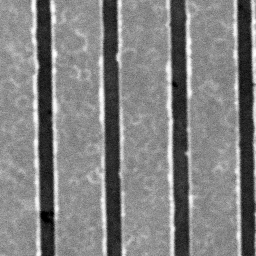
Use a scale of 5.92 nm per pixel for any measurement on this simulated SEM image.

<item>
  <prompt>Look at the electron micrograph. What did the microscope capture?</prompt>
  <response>one or a few lines or trenches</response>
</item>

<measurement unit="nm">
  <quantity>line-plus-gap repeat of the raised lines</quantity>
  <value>399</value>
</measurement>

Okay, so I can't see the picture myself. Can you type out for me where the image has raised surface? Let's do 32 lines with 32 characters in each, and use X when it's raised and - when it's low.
XXXX--XXXXXXX--XXXXXX--XXXXXXX-X
XXXX--XXXXXXX--XXXXXX--XXXXXXX--
XXXX--XXXXXXX--XXXXXX--XXXXXXX--
XXXX--XXXXXXX--XXXXXX--XXXXXXX--
XXXX---XXXXXX--XXXXXX--XXXXXXX--
XXXX---XXXXXX--XXXXXX--XXXXXXX--
XXXX---XXXXXX--XXXXXX--XXXXXXX--
XXXXX--XXXXXX--XXXXXX--XXXXXXX--
XXXXX--XXXXXX--XXXXXX---XXXXXX--
XXXXX--XXXXXX--XXXXXX---XXXXXX--
XXXXX--XXXXXX--XXXXXX--XXXXXXX--
XXXXX--XXXXXX--XXXXXX---XXXXXX--
XXXXX--XXXXXX--XXXXXX---XXXXXX--
XXXXX--XXXXXX--XXXXXX--XXXXXXX--
XXXXX--XXXXXX--XXXXXX--XXXXXXX--
XXXXX--XXXXXX--XXXXXXX--XXXXXX--
XXXXX--XXXXXX--XXXXXX---XXXXXX--
XXXXX--XXXXXX--XXXXXX---XXXXXX--
XXXXX--XXXXXX--XXXXXX---XXXXXX--
XXXXX--XXXXXX--XXXXXX---XXXXXX--
XXXXX--XXXXXX--XXXXXXX--XXXXXX--
XXXXX--XXXXXX--XXXXXXX--XXXXXX--
XXXXX--XXXXXX--XXXXXXX--XXXXXX--
XXXXX--XXXXXX--XXXXXXX--XXXXXX--
XXXXX--XXXXXX--XXXXXXX--XXXXXX--
XXXXX--XXXXXX--XXXXXXX--XXXXXX--
XXXXX--XXXXXX--XXXXXXX--XXXXXX--
XXXXX--XXXXXX--XXXXXXX--XXXXXX--
XXXXX--XXXXXX--XXXXXXX--XXXXXX--
XXXXX--XXXXXX--XXXXXXX--XXXXXX--
XXXXX--XXXXXX--XXXXXXX--XXXXXX--
XXXXX--XXXXXX--XXXXXXX--XXXXXX--